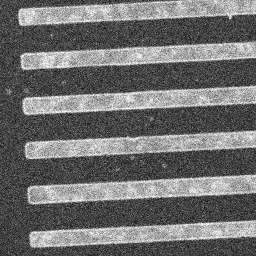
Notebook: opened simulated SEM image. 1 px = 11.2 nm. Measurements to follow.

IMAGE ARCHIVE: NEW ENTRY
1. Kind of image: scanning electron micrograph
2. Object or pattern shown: parallel lines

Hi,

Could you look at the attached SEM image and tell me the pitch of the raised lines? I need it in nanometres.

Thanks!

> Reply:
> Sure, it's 499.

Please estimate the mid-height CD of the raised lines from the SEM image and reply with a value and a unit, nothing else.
16.1 pixels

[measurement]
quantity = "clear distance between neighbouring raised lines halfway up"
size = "322 nanometers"